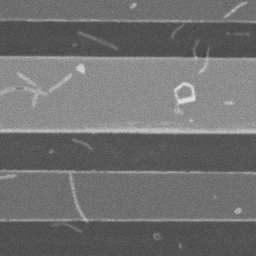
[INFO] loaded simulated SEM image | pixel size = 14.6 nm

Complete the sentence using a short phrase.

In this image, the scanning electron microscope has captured lines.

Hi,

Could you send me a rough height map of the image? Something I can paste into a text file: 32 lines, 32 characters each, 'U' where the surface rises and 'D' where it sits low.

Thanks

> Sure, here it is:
UUUUUUUUUUUUUUUUUUUUUUUUUUUUUUUU
UUUUUUUUUUUUUUUUUUUUUUUUUUUUUUUU
DDDUUUUUUUUUUUUUUUUUUUUUUUUUUUUU
DDDDDDDDDDDDDDDDDDDDDDDDDDDDDDDD
DDDDDDDDDDDDDDDDDDDDDDDDDDDDDDDD
DDDDDDDDDDDDDDDDDDDDDDDDDDDDDDDD
DDDDDDDDDDDDDDDDDDDDDDDDDDDDDDDD
UUUUUUUUUUUUUUUUUUUUUUUUUUUUUUUU
UUUUUUUUUUUUUUUUUUUUUUUUUUUUUUUU
UUUUUUUUUUUUUUUUUUUUUUUUUUUUUUUU
UUUUUUUUUUUUUUUUUUUUUUUUUUUUUUUU
UUUUUUUUUUUUUUUUUUUUUUUUUUUUUUUU
UUUUUUUUUUUUUUUUUUUUUUUUUUUUUUUU
UUUUUUUUUUUUUUUUUUUUUUUUUUUUUUUU
UUUUUUUUUUUUUUUUUUUUUUUUUUUUUUUU
UUUUUUUUUUUUUUUUUUUUUUUUUUUUUUUU
DDUUUUUUUUUUUUUUUUUUUUUUUUUUUUUU
DDDDDDDDDDDDDDDDDDDDDDDDDDDDDDDD
DDDDDDDDDDDDDDDDDDDDDDDDDDDDDDDD
DDDDDDDDDDDDDDDDDDDDDDDDDDDDDDDD
DDDDDDDDDDDDDDDDDDDDDDDDDDDDDDDD
UUUUUUUUUUUUUUUUUUUUUUUUUDUUDDDD
UUUUUUUUUUUUUUUUUUUUUUUUUUUUUUUU
UUUUUUUUUUUUUUUUUUUUUUUUUUUUUUUU
UUUUUUUUUUUUUUUUUUUUUUUUUUUUUUUU
UUUUUUUUUUUUUUUUUUUUUUUUUUUUUUUU
UUUUUUUUUUUUUUUUUUUUUUUUUUUUUUUU
UUUUUUUUUUUUUUUUUUUUUUUUUUUUUUUU
DDDDDDDDDDDDDDDDDDDDDDDDDDDDDDDD
DDDDDDDDDDDDDDDDDDDDDDDDDDDDDDDD
DDDDDDDDDDDDDDDDDDDDDDDDDDDDDDDD
DDDDDDDDDDDDDDDDDDDDDDDDDDDDDDDD